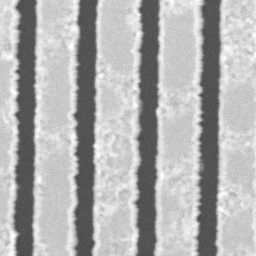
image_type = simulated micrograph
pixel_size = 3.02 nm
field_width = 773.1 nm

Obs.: lines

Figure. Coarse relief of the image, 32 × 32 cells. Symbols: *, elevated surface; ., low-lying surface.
**...*****..******..*****...****
**...*****..*****...*****...****
**...*****..******..*****...****
**...*****..******..*****...****
**...*****..******..*****..*****
**..******..******..*****...****
**..******..*****...*****...****
**...*****..******..*****..*****
**..******..*****...*****...****
**..******..*****...*****...****
**..******..*****...*****..*****
**..******..*****...*****..*****
**...****...*****...*****..*****
**..*****...*****...*****..*****
**..*****...*****...*****..*****
**..*****...*****...*****..*****
**..*****...*****...*****..*****
**..******..*****...*****..*****
**..******..*****...*****..*****
**..*****...*****...*****..*****
**..******..*****...*****..*****
**..******..*****...*****..*****
**..*****...*****...*****..*****
**..******..*****..******..*****
**..******..*****...*****..*****
**..******..*****...*****..*****
**..*****...*****...*****..*****
**..*****...*****...*****..*****
**..*****...*****...*****..*****
**..*****...*****...*****..*****
**..*****...*****...*****..*****
**..*****...*****..******..*****